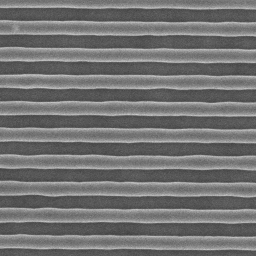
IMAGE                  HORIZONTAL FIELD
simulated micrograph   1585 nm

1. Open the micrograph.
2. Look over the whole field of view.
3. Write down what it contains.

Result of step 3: wiring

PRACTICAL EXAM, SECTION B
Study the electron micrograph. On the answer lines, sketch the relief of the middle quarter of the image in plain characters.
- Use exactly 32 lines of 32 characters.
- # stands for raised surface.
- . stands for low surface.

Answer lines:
................................
................................
................................
################################
################################
################################
................................
................................
................................
########.###############........
################################
################################
################################
................................
................................
................................
##########################...###
################################
################################
..............####..............
................................
................................
................................
################################
################################
################################
................................
................................
................................
..........#.....................
################################
################################